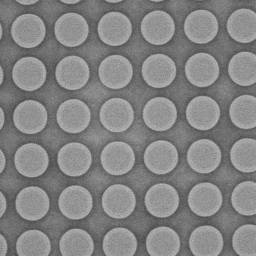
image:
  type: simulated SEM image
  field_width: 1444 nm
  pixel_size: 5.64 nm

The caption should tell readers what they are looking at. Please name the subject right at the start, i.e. an array of small figures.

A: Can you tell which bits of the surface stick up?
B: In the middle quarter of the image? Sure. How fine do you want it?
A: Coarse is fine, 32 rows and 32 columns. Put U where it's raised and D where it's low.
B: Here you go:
UUUUUUDDDUUUUUUUUDDDUUUUUUUUDDUU
UUUUUUDDDUUUUUUUUDDDUUUUUUUUDDUU
UUUUUUDDDUUUUUUUUDDDUUUUUUUUDDUU
UUUUUUDDDUUUUUUUUDDDUUUUUUUUDDDU
UUUUUUDDDDUUUUUUDDDDDUUUUUUDDDDD
UUUUUDDDDDDUUUUDDDDDDDUUUUDDDDDD
DDDDDDDDDDDDDDDDDDDDDDDDDDDDDDDD
DDDDDDDDDDDDDDDDDDDDDDDDDDDDDDDD
DDDDDDDDDDDDDDDDDDDDDDDUUDDDDDDD
UUUUUDDDDDDUUUUUDDDDDUUUUUUDDDDD
UUUUUUDDDDUUUUUUUDDDUUUUUUUUDDDU
UUUUUUDDDUUUUUUUUDDDUUUUUUUUDDDU
UUUUUUDDDUUUUUUUUDDDUUUUUUUUDDDU
UUUUUUDDDUUUUUUUUDDDUUUUUUUUDDDU
UUUUUUDDDUUUUUUUUDDDUUUUUUUUDDDU
UUUUUUDDDDUUUUUUDDDDDUUUUUUDDDDD
UUUUUDDDDDDUUUUDDDDDDDDUUDDDDDDD
DDDDDDDDDDDDDDDDDDDDDDDDDDDDDDDD
DDDDDDDDDDDDDDDDDDDDDDDDDDDDDDDD
DDDDDDDDDDDDDDDDDDDDDDDUUUDDDDDD
UUUUUDDDDDDUUUUUDDDDDUUUUUUDDDDD
UUUUUUDDDDUUUUUUUDDDDUUUUUUUDDDU
UUUUUUUDDUUUUUUUUDDDUUUUUUUUDDDU
UUUUUUUDDUUUUUUUUUDDUUUUUUUUDDDU
UUUUUUUDDUUUUUUUUDDDUUUUUUUUDDDU
UUUUUUDDDDUUUUUUUDDDDUUUUUUUDDDD
UUUUUUDDDDUUUUUUDDDDDUUUUUUDDDDD
UUUUUDDDDDDDUUUDDDDDDDDDDDDDDDDD
DDDDDDDDDDDDDDDDDDDDDDDDDDDDDDDD
DDDDDDDDDDDDDDDDDDDDDDDDDDDDDDDD
DDDDDDDDDDDDUUUDDDDDDDUUUUUDDDDD
UUUUUUDDDDDUUUUUUDDDDUUUUUUUDDDD